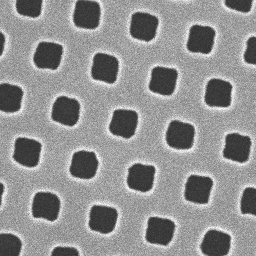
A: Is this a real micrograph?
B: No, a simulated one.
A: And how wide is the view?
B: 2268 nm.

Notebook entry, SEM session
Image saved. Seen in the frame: a regular array of holes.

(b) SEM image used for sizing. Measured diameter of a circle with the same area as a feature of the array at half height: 264 nanometres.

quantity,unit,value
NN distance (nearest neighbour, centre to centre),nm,501